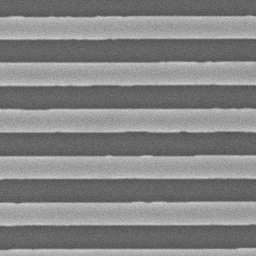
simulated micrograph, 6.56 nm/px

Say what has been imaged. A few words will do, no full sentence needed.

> lines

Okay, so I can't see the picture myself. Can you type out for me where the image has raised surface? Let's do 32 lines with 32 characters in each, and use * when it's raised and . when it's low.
................................
................................
********************************
********************************
********************************
................................
................................
................................
********************************
********************************
************************...*****
................................
................................
................................
********************************
********************************
................................
................................
................................
................................
********************************
********************************
................................
................................
................................
********************************
********************************
********************************
................................
................................
................................
********************************